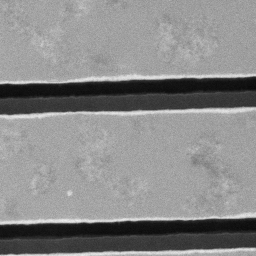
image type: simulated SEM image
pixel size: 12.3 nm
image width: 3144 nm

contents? lines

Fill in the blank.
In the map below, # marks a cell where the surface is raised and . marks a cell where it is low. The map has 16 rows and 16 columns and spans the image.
################
################
################
################
################
................
................
################
################
################
################
################
################
################
................
................